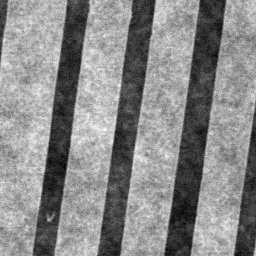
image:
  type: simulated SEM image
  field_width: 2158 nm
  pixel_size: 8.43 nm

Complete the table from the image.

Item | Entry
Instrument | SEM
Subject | one or a few lines or trenches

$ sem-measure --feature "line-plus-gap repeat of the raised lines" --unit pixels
67.8